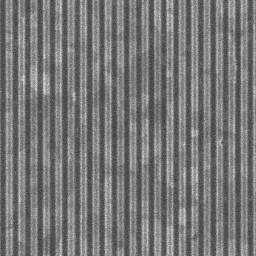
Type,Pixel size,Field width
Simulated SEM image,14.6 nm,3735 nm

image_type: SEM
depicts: parallel lines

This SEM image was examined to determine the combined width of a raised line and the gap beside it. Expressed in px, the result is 12.4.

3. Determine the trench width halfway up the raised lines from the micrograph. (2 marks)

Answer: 82.1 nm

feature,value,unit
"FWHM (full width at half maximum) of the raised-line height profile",0.0949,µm